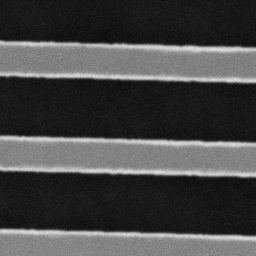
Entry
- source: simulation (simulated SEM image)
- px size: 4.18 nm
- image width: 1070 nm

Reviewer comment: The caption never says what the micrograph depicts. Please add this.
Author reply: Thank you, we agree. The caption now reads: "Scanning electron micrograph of lines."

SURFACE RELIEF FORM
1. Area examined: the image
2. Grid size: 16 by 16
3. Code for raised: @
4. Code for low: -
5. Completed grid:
----------------
----------------
----------------
@@@@@@@@@@@@@@@@
@@@@@@@@@@@@@@@@
----------------
----------------
----------------
----------------
@@@@@@@@@@@@@@@@
@@@@@@@@@@@@@@@@
----------------
----------------
----------------
@@@@@@----------
@@@@@@@@@@@@@@@@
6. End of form